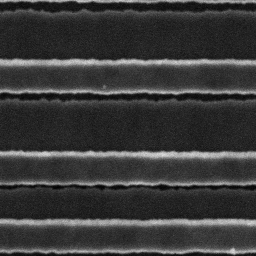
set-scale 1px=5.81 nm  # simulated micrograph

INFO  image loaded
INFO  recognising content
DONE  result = lines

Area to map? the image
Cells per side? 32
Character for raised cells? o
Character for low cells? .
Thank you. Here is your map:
................................
................................
................................
................................
................................
................................
................................
................o...............
oooooooooooooooooooooooooooooooo
oooooooooooooooooooooooooooooooo
oooooooooooooooooooooooooooooooo
oooooooooooooooooooooooooooooooo
................................
................................
................................
................................
................................
................................
................................
oooooooooooooooooooooooooooooooo
oooooooooooooooooooooooooooooooo
oooooooooooooooooooooooooooooooo
oooooooooooooooooooooooooooooooo
................................
................................
................................
................................
................................
oooooooooooooooooooooooooooooooo
oooooooooooooooooooooooooooooooo
oooooooooooooooooooooooooooooooo
oo.o.ooooooooooooo.ooooo.ooooooo